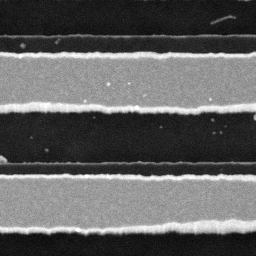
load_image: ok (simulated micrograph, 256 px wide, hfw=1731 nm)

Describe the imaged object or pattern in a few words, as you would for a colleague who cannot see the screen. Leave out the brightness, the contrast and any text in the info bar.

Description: lines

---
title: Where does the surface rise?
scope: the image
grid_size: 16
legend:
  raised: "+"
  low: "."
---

................
................
................
++++++++++++++++
++++++++++++++++
++++++++++++++++
++++++++++++++++
................
................
................
................
++++++++++++++++
++++++++++++++++
++++++++++++++++
++++++++.+......
................